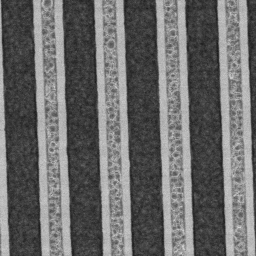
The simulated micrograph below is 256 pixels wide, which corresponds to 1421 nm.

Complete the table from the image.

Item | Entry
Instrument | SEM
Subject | parallel lines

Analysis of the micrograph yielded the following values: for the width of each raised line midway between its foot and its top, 0.121 um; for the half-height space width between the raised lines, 220 nm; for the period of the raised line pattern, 341 nanometres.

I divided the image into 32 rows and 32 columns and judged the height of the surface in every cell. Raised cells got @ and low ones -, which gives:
-----@@-----@@@-----@@@-----@@--
-----@@-----@@@-----@@@-----@@--
-----@@-----@@@-----@@@-----@@--
-----@@-----@@@-----@@@-----@@--
-----@@-----@@@-----@@@-----@@@-
-----@@-----@@@-----@@@-----@@@-
-----@@@----@@@-----@@@-----@@@-
-----@@@----@@@-----@@@-----@@@-
-----@@@-----@@-----@@@-----@@@-
-----@@@----@@@-----@@@-----@@@-
-----@@@-----@@-----@@@-----@@@-
-----@@@-----@@-----@@@-----@@@-
-----@@@-----@@-----@@@-----@@@-
-----@@@-----@@-----@@@-----@@@-
-----@@@-----@@-----@@@-----@@@-
-----@@@-----@@@----@@@-----@@@-
-----@@@-----@@@----@@@-----@@@-
-----@@@-----@@@-----@@-----@@@-
-----@@@-----@@@-----@@-----@@@-
-----@@@-----@@@-----@@-----@@@-
-----@@@-----@@@-----@@-----@@@-
-----@@@-----@@@-----@@-----@@@-
-----@@@-----@@@-----@@-----@@@-
-----@@@-----@@@-----@@-----@@@-
-----@@@-----@@@-----@@@----@@@-
-----@@@-----@@@-----@@@-----@@-
@-----@@-----@@@-----@@@-----@@-
@----@@@-----@@@-----@@@-----@@-
@-----@@-----@@@-----@@@-----@@-
@-----@@-----@@@-----@@@-----@@-
@-----@@-----@@@-----@@@-----@@-
@-----@@-----@@@-----@@@-----@@-